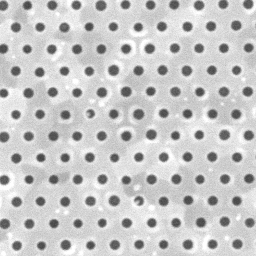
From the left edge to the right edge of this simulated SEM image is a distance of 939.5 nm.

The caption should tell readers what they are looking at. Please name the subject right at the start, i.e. a regular array of holes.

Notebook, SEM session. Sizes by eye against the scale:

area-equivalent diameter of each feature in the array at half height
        39.3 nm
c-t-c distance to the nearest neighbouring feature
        0.0885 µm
